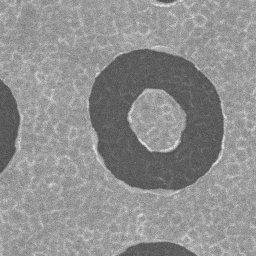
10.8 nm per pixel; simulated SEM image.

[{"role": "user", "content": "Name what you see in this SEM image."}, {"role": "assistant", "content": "ring-shaped grooves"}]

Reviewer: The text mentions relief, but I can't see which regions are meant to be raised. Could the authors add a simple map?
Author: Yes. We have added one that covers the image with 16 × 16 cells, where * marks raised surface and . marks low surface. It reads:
****************
****************
****************
*******....*****
******.......***
.*****.......***
.*****..***...**
.*****..***...**
.*****...**...**
.*****........**
*******......***
********....****
****************
****************
****************
********....****